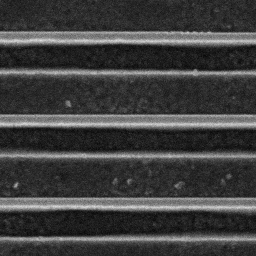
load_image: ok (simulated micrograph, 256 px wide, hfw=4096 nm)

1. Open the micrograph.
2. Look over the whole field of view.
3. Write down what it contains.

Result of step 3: lines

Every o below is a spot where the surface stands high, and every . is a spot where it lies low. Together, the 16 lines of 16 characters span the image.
oooooooooooooooo
oooooooooooooooo
oooooooooooooooo
................
................
oooooooooooooooo
oooooooooooooooo
oooooooooooooooo
................
................
oooooooooooooooo
oooooooooooooooo
oooooooooooooooo
................
................
oooooooooooooooo